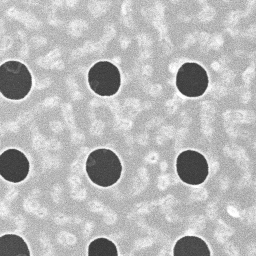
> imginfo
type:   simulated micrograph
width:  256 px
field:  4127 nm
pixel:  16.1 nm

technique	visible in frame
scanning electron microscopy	holes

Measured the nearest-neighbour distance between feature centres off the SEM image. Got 1410 nm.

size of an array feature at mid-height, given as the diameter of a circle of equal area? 34.8 px